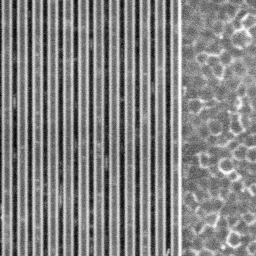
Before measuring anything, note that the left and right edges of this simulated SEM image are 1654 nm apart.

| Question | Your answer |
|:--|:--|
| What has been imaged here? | parallel lines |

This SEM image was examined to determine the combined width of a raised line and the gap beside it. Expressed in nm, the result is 99.1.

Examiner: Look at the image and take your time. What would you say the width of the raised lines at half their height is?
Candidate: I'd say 0.0565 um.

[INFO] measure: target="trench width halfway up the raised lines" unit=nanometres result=43.6